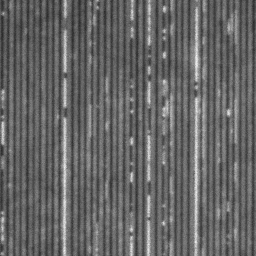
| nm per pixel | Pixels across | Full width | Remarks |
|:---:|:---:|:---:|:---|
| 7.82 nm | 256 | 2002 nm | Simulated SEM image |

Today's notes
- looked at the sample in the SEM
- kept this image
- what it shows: parallel lines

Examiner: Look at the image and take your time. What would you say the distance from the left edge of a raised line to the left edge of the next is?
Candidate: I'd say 50.4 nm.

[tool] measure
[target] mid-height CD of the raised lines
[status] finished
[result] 31.3 nm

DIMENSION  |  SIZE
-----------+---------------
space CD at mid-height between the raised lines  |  1.99 pixels